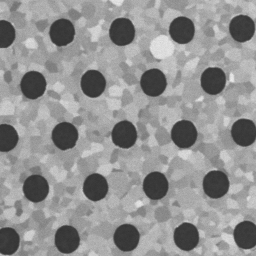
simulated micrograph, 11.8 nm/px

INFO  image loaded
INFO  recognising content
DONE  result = a regular array of holes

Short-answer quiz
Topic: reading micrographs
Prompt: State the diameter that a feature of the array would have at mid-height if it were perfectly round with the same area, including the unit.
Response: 0.321 micrometres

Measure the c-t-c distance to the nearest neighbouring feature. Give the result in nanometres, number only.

698